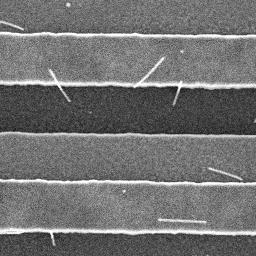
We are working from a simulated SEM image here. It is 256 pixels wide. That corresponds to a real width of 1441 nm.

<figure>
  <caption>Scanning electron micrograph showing lines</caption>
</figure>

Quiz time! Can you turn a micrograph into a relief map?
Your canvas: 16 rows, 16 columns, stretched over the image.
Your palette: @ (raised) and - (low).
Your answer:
@@@@@@@@@@@@@@@@
@@@@@@@@@@@@@@@@
@@@@@@@@@@@@@@@@
@@@@@@@@@@@@@@@@
@@@@@@@@@@@@@@@@
----------------
----------------
----------------
@@@@@@@@@@@@@@@@
@@@@@@@@@@@@@@@@
@@@@@@@@@@@@@@@@
@@@@@@@@@@@@@@@@
@@@@@@@@@@@@@@@@
@@@@@@@@@@@@@@@@
@@-@---@@@@@@@@@
----------------